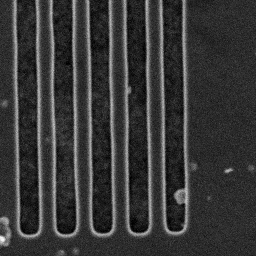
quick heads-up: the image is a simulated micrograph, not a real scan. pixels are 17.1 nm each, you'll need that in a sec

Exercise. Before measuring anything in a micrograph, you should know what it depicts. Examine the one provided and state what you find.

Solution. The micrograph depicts groups of lines, slits or small figures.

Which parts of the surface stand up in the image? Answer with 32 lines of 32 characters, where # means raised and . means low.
##...#...##...##..##...#########
##...#...##...##..##...#########
##...#...##...##..##...#########
##...##..##...##..##...#########
##...##..##...##..##...#########
##...##..##...##..##...#########
##...##..##...##...#...#########
##...##..##...##..##...#########
##...##..##...##..##...#########
##...##..##...##..##...#########
##...##..##...##..##...#########
##...##..##...##...#...#########
##...##..##...##...#...#########
##...##..##...##...#...#########
##...##..##...##...#...#########
##...##..##...##...#...#########
##...##..##...##...#...#########
##...##..##...##...#...#########
##...##..##...##...#...#########
##...##..##...##...#...#########
##...##..##...##...#...#########
##...##..##...##...#...#########
##...##...#...##...##..#########
##...##...#...##...##..#########
##...##...#...##...##..#########
##...##...#...##...##..#########
##...##...#...##...##..#########
##...##...#...##...##..#########
##...##...##..##...##..#########
################################
################################
################################